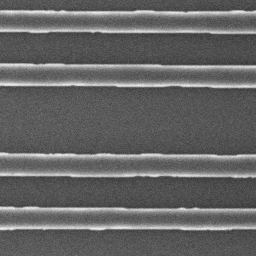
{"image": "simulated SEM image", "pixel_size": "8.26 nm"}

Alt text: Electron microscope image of lines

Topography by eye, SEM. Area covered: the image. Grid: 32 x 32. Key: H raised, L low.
LLLLLLLLLLLLLLLLLLLLLLLLLLLLLLLL
HHHHHHHHLLLLLLLLLHHHLLLLLLLLLHHL
HHHHHHHHHHHHHHHHHHHHHHHHHHHHHHHH
HHHHHHHHHHHHHHHHHHHHHHHHHHHHHHHH
LLLLLLLLLLLLLLLLLLLLLLLLLLLLLLLL
LLLLLLLLLLLLLLLLLLLLLLLLLLLLLLLL
LLLLLLLLLLLLLLLLLLLLLLLLLLLLLLLL
LLLLLLLLLLLLLLLLLLLLLLLLLLLLLLLL
HHHHHHHHHHHHHHHHHHHHHHHHHHHHHHHH
HHHHHHHHHHHHHHHHHHHHHHHHHHHHHHHH
HHHHHHHHHHHHHHHHHHHHHHHHHHHHHHHH
LLLLLLLLLLLLLLLLLLLLLLLLLLLLLLLL
LLLLLLLLLLLLLLLLLLLLLLLLLLLLLLLL
LLLLLLLLLLLLLLLLLLLLLLLLLLLLLLLL
LLLLLLLLLLLLLLLLLLLLLLLLLLLLLLLL
LLLLLLLLLLLLLLLLLLLLLLLLLLLLLLLL
LLLLLLLLLLLLLLLLLLLLLLLLLLLLLLLL
LLLLLLLLLLLLLLLLLLLLLLLLLLLLLLLL
LLLLLLLLLLLLLLLLLLLLLLLLLLLLLLLL
HHHHHHHHHHHHHHHHHHHHHHHHHHHLLHHH
HHHHHHHHHHHHHHHHHHHHHHHHHHHHHHHH
HHHHHHHHHHHHHHHHHHHHHHHHHHHHHHHH
LLLLLLLLLLLLLLLLLLLLLLLLLLLLLLLL
LLLLLLLLLLLLLLLLLLLLLLLLLLLLLLLL
LLLLLLLLLLLLLLLLLLLLLLLLLLLLLLLL
LLLLLLLLLLLLLLLLLLLLLLLLLLLLLLLL
HHHHHHHHHHHHHHHHHHHHHHHHHHHHHHHH
HHHHHHHHHHHHHHHHHHHHHHHHHHHHHHHH
HHHHHHHHHHHHHHHHHHHHHHHHHHHHHHHH
LLLLLLLLLLLLLLLLLLLLLLLLLLLLLLLL
LLLLLLLLLLLLLLLLLLLLLLLLLLLLLLLL
LLLLLLLLLLLLLLLLLLLLLLLLLLLLLLLL